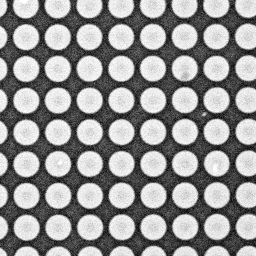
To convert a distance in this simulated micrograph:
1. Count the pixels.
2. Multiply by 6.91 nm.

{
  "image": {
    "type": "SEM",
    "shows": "an array of small figures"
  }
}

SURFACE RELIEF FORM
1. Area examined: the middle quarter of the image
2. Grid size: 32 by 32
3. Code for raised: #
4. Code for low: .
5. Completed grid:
#..######..######..######..#####
#..######..######..######..#####
#...#####...#####..######..#####
#...####....####....####....####
................................
................................
.....###.....###.....###....####
#...#####...#####...#####...####
#..######..######..######..#####
##.######..######..######..#####
#...#####...#####...#####..#####
#...####....####....####....####
................................
................................
.....###.....###....####....####
#...#####...#####...#####...####
##.######..######..######..#####
##.######..######..######..#####
#...#####...#####...#####...####
#....###.....###....####....####
................................
................................
.....###.....###....####....####
#...#####...#####...#####..#####
##.######..######..######..#####
##.######..######..######..#####
#...#####...#####...#####...####
.....###.....###....####.....###
................................
................................
.....###....####....####....####
#...#####...#####...#####...####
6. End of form